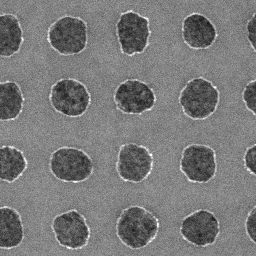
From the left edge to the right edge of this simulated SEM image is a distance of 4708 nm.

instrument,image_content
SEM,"a regular array of raised bodies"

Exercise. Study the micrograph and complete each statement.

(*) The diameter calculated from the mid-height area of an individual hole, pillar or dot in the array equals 37.2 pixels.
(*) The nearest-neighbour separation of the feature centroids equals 1170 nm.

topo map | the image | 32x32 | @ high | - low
--------------------------------
--------------------------------
@@-----@@@-----@@@-----@@@-----@
@@@---@@@@@----@@@@----@@@@----@
@@@---@@@@@----@@@@----@@@@----@
@@@---@@@@@----@@@-----@@@-----@
@@-----@@@------@---------------
--------------------------------
--------------------------------
--------------------------------
@@-----@@@-----@@@-----@@@-----@
@@@---@@@@@----@@@@----@@@@---@@
@@@---@@@@@---@@@@@----@@@@----@
@@@----@@@@----@@@@----@@@@----@
@@-------@--------------@@------
--------------------------------
--------------------------------
--------------------------------
@@------@------@@@-----@@@-----@
@@@---@@@@@----@@@@----@@@@----@
@@@---@@@@@@---@@@@----@@@@----@
@@@----@@@@----@@@@----@@@@----@
-@------@@------@@------@@------
--------------------------------
--------------------------------
--------------------------------
@@-------------@@@@-----@@-----@
@@@----@@@@----@@@@----@@@@----@
@@@----@@@@----@@@@@---@@@@----@
@@@----@@@@----@@@@----@@@@----@
@@------@@@-----@@------@@------
--------------------------------